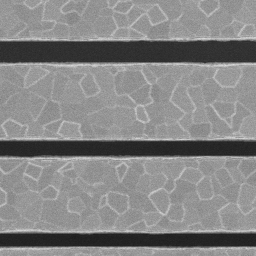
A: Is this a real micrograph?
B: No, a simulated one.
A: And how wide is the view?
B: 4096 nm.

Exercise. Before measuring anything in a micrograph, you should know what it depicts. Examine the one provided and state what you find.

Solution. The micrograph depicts lines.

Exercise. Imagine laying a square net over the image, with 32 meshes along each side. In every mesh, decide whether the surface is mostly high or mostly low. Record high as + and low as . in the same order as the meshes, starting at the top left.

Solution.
++++++++++++++++++++++++++++++++
++++++++++++++++++++++++++++++++
++++++++++++++++++++++++++++++++
++++++++++++++++++++++++++++++++
++++++++++++++++++++++++++++++++
................................
................................
................................
++++++++++++++++++++++++++++++++
++++++++++++++++++++++++++++++++
++++++++++++++++++++++++++++++++
++++++++++++++++++++++++++++++++
++++++++++++++++++++++++++++++++
++++++++++++++++++++++++++++++++
++++++++++++++++++++++++++++++++
++++++++++++++++++++++++++++++++
++++++++++++++++++++++++++++++++
..................++.++.........
................................
................................
++++++++++++++++++++++++++++++++
++++++++++++++++++++++++++++++++
++++++++++++++++++++++++++++++++
++++++++++++++++++++++++++++++++
++++++++++++++++++++++++++++++++
++++++++++++++++++++++++++++++++
++++++++++++++++++++++++++++++++
++++++++++++++++++++++++++++++++
++++++++++++++++++++++++++++++++
................................
................................
++++++++++++++++++++++++++++++++